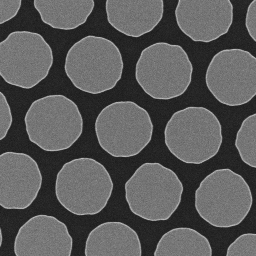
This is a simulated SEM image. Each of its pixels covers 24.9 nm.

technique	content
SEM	an array of small figures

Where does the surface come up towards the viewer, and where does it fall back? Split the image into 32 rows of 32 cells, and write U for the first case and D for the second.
UUUDUUUUUUUUDUUUUUUUDDUUUUUUUDDU
UUDDDUUUUUUDDUUUUUUUDDUUUUUUUDDU
UDDDDUUUUUUDDDUUUUUUDDUUUUUUUDDU
DDDDDDDUUDDDDDUUUUUDDDDUUUUUUDDU
DUUUUDDDDDDDDDDDUDDDDDDDUUUUDDDU
UUUUUUDDDUUUUUDDDDDUUDDDDDDDDDDD
UUUUUUDDDUUUUUUDDDUUUUUDDDDDUUUD
UUUUUUUDUUUUUUUDDUUUUUUUDDDUUUUU
UUUUUUDDUUUUUUUDDUUUUUUUDDUUUUUU
UUUUUUDDDUUUUUUDDUUUUUUUDDUUUUUU
DUUUUDDDDUUUUUDDDUUUUUUUDDUUUUUU
DDDDDDDDDDDUUDDDDDUUUUUDDDUUUUUU
UDDDDUUUUDDDDDDDDDDDDDDDDDDUUUUD
UDDDUUUUUUDDDUUUUUDDDDDUUDDDDDDD
UDDUUUUUUUDDUUUUUUUDDDUUUUUDDDDU
UDDUUUUUUUDDUUUUUUUDDUUUUUUDDDUU
UDDUUUUUUUDDUUUUUUUDDUUUUUUUDDUU
DDDDUUUUUUDDUUUUUUUDDUUUUUUUDDUU
DDDDDUUUDDDDDUUUUUDDDUUUUUUDDDUU
UUUUDDDDDDDDDDUUDDDDDDUUUUUDDDUU
UUUUUDDDUUUUUDDDDDUUDDDDDDDDDDDU
UUUUUDDUUUUUUDDDDUUUUUDDDDDUUDDD
UUUUUDDUUUUUUUDDUUUUUUDDDUUUUUUD
UUUUUDDUUUUUUUDDUUUUUUUDDUUUUUUD
UUUUUDDUUUUUUUDDUUUUUUUDUUUUUUUD
UUUUDDDDUUUUUDDDUUUUUUDDUUUUUUUD
DDDDDDDDDUUUDDDDDUUUUUDDDUUUUUUD
DDDDUUUDDDDDDDDDDDDUDDDDDDUUUUDD
DDDUUUUUDDDDUUUUDDDDDDDDDDDDDDDD
DDUUUUUUUDDUUUUUUDDDUUUUUDDDDDUU
DDUUUUUUUDDUUUUUUUDDUUUUUUDDDUUU
DDUUUUUUUDDUUUUUUUDUUUUUUUDDUUUU